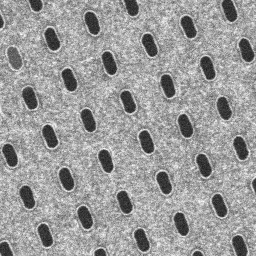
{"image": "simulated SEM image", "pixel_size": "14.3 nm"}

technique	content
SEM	a regular array of raised bodies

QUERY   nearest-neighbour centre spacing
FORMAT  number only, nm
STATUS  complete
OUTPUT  606